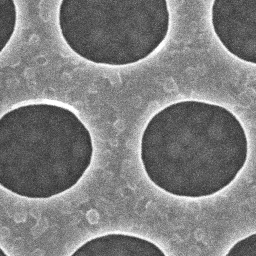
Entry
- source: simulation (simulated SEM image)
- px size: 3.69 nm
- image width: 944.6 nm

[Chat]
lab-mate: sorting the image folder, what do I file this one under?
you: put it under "holes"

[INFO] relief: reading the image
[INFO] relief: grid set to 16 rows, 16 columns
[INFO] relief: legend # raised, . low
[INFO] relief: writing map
.###......###...
.###.......##...
.###......####..
#####....######.
################
################
##.########..###
.....####......#
......###......#
......###......#
.....####......#
.....#####....##
################
################
################
#####.....####..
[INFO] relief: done